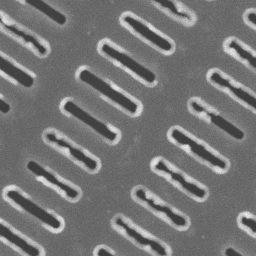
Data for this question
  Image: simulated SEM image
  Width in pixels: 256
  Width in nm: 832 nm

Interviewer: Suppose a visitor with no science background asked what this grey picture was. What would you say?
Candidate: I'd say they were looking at a regular array of holes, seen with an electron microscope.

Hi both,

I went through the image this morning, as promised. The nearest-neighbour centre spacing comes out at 0.114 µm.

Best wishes